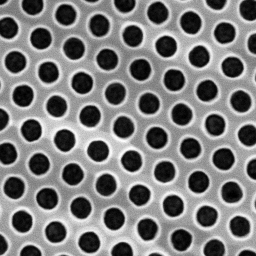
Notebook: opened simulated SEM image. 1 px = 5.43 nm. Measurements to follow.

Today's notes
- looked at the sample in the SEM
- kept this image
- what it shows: a regular array of holes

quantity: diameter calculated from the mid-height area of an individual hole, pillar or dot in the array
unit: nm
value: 122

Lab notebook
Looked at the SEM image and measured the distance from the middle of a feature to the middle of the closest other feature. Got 34.3 pixels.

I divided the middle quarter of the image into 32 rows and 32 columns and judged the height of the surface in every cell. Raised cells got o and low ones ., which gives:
oooooooo.....ooo......oooooooooo
oooooooooo..oooo......oooo...ooo
ooo...ooooooooooo.....ooo.....oo
oo.....oooooooooo....oooo.....oo
oo.....oooooooooooooooooo......o
oo.....oooo....oooooooooo.....oo
ooo....ooo......oooooooooo...ooo
oooo.ooooo......oooo..oooooooooo
oooooooooo.....oooo.....oooooooo
.oooooooooo....ooo......oooooooo
.oooo...ooooooooooo.....oooo...o
.ooo.....oooooooooo.....ooo.....
oooo.....ooooooooooo...oooo.....
oooo.....oooo...ooooooooooo.....
oooo.....ooo.....oooooooooo.....
ooooo...oooo......ooooooooooo.oo
..oooooooooo......ooo....ooooooo
...oooooooooo....oooo.....oooooo
...ooooooooooo..oooo......oooo..
...oooo...ooooooooooo.....ooo...
...ooo.....oooooooooo....oooo...
.ooooo.....ooooo.oooooooooooo...
oooooo.....oooo....oooooooooo...
oooooo.....ooo.....ooooooooooo..
oooooooo.ooooo......oooo...ooooo
....ooooooooooo....oooo.....oooo
.....oooooooooo....ooo......oooo
.....oooo...oooooooooo......oooo
.....ooo.....oooooooooo....oooo.
....oooo.....ooooooooooo..ooooo.
oo.ooooo.....oooo...ooooooooooo.
oooooooo.....ooo......oooooooooo